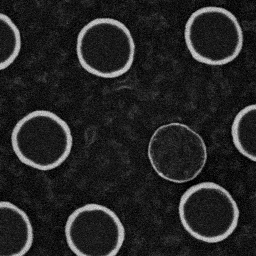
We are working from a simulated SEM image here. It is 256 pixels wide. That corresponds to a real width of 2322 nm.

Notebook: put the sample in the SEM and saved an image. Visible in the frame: raised bodies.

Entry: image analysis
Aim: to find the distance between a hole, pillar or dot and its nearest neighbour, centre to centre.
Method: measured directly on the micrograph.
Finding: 1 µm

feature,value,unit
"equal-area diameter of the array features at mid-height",55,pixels